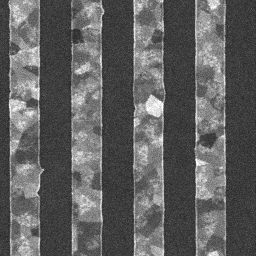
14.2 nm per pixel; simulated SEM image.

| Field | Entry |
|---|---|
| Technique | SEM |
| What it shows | parallel lines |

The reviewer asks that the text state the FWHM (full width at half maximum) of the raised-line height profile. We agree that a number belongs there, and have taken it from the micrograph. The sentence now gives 0.413 µm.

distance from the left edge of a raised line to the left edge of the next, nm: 881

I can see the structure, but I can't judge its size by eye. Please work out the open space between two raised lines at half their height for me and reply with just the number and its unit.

463 nm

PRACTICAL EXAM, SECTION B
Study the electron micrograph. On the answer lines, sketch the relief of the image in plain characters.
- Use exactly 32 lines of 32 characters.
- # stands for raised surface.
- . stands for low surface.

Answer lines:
.####....####....###.....###....
.####....####....###.....###....
.####....####....###.....###....
.####....####....###.....###....
.####....####....###.....###....
.####....####....###.....###....
.####....####....###.....###....
.####....####....###.....###....
.####....####....###.....###....
.####....####....###....####....
.####....####....###.....###....
.####....####....####....###....
.####....####....###.....###....
.####....####....###.....###....
.####....####....###.....###....
.####....####....###.....###....
.####....####....###.....###....
.####....####....###.....###....
.####....####....###....####....
.####....####....###....####....
.####....####....###.....###....
.####....####....###....####....
.####....####....###.....###....
.####....####....###.....###....
.####....####....###.....###....
.####....####....###.....###....
.####....####....####....###....
.####....####....####....###....
.####....####....###.....###....
.####....####....###.....###....
.####....####....###.....###....
.####....####....###.....###....